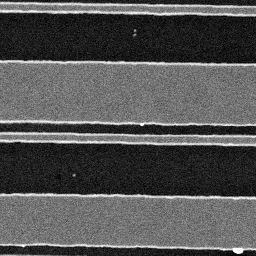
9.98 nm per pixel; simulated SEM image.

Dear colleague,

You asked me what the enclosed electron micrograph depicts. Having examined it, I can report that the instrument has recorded lines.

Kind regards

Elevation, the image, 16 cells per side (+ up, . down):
++++++++++++++++
................
................
................
++++++++++++++++
++++++++++++++++
++++++++++++++++
++++++++++++++++
++++++++++++++++
................
................
................
++++++++++++++++
++++++++++++++++
++++++++++++++++
++++++++++++++++